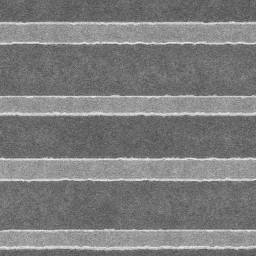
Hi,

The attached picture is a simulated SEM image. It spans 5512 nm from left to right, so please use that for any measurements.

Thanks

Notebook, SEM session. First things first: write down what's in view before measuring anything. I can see lines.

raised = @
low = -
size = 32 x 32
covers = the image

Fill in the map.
--------------------------------
--------------------------------
--------------------------------
@@@@@@@@@@@@@@@@@@@@@@@@@@@@@@@@
@@@@@@@@@@@@@@@@@@@@@@@@@@@@@@@@
--------------------------------
--------------------------------
--------------------------------
--------------------------------
--------------------------------
--------------------------------
--------------------------------
@@@@@@@@@@@@@@@@@@@@@@@@@@@@@@@@
@@@@@@@@@@@@@@@@@@@@@@@@@@@@@@@@
--------------------------------
--------------------------------
--------------------------------
--------------------------------
--------------------------------
--------------------------------
@@@@@@@@@@@@@@@@@@@@@@@@@@@@@@@@
@@@@@@@@@@@@@@@@@@@@@@@@@@@@@@@@
@-@@@@-----@@@@--------@@@@--@--
--------------------------------
--------------------------------
--------------------------------
--------------------------------
--------------------------------
--------------------------------
@@@@@@@@@@@@@@@@@@@@@@@@@@@@@@@@
@@@@@@@@@@@@@@@@@@@@@@@@@@@@@@@@
--------------------------------